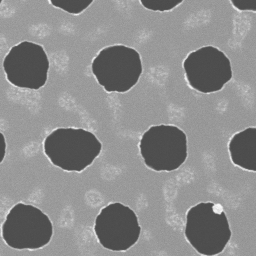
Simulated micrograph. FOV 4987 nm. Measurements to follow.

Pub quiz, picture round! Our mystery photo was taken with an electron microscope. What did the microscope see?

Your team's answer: a regular array of holes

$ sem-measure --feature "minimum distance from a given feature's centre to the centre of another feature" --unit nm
1760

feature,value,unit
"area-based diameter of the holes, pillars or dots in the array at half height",47.6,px